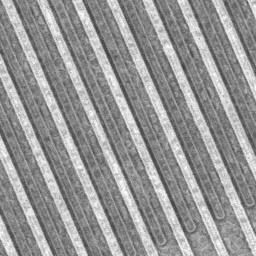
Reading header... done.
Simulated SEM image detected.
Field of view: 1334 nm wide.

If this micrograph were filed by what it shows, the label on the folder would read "parallel lines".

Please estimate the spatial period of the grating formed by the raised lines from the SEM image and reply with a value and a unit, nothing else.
83.4 nanometers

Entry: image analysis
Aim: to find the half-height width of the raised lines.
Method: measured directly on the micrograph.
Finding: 41.7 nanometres